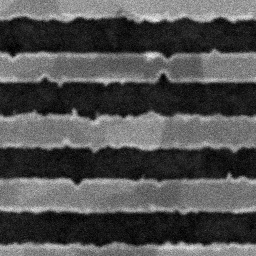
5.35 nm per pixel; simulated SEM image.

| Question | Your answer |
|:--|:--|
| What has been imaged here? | one or a few lines or trenches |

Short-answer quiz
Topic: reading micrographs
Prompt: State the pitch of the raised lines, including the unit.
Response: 0.343 µm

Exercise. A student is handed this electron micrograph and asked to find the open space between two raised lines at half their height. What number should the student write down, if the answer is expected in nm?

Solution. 186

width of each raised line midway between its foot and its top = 0.159 um